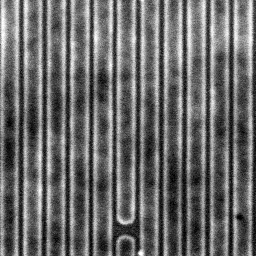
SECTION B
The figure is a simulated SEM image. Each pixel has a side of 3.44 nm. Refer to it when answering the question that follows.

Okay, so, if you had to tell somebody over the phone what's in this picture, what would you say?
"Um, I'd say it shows parallel lines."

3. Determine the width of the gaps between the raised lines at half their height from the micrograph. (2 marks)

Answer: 21.1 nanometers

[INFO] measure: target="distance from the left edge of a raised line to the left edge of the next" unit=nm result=80.4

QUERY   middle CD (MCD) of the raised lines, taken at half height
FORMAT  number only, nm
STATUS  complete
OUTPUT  61.1